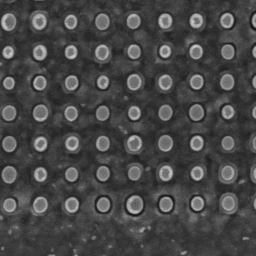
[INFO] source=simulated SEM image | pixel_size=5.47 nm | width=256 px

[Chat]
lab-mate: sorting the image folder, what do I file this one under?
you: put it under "a regular array of raised bodies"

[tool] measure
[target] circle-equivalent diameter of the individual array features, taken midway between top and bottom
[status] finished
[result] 0.0742 micrometres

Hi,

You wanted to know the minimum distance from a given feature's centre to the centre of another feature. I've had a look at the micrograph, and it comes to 166 nm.